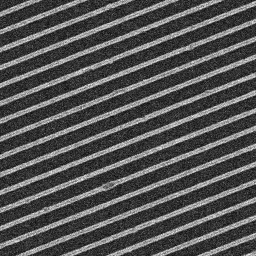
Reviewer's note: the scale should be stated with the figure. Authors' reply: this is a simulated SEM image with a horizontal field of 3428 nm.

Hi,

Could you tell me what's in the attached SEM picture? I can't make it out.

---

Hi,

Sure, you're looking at parallel lines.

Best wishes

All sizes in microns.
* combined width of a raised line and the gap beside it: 0.222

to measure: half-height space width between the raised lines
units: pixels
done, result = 13.7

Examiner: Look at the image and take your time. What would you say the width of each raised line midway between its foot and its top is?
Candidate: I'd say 39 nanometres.